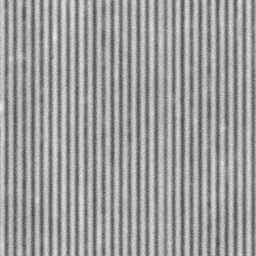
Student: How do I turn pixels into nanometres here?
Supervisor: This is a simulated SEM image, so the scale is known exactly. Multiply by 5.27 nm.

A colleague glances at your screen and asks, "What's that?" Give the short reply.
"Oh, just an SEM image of parallel lines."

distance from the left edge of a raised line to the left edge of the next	46.5	nm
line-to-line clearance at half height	0.0198	microns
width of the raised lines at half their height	24.4	nm